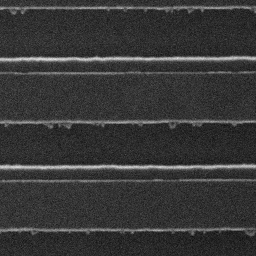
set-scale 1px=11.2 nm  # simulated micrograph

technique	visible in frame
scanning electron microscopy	lines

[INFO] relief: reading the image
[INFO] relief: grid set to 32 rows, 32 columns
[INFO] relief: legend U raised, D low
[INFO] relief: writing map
UUUUUUUUUUUUUUUUUUUUUUUUUUUUUUUU
DUDDDDDDDDDDDDDDDDDDDDDDDDDDDDDD
DDDDDDDDDDDDDDDDDDDDDDDDDDDDDDDD
DDDDDDDDDDDDDDDDDDDDDDDDDDDDDDDD
DDDDDDDDDDDDDDDDDDDDDDDDDDDDDDDD
DDDDDDDDDDDDDDDDDDDDDDDDDDDDDDDD
DDDDDDDDDDDDDDDDDDDDDDDDDDDDDDDD
DDDDDDDDDDDDDDDDDDDDDDDDDDDDDDDD
DDDDDDDDDDDDDDDDDDDDDDDDDDDDDDDD
UUUUUUUUUUUUUUUUUUUUUUUUUUUUUUUU
UUUUUUUUUUUUUUUUUUUUUUUUUUUUUUUU
UUUUUUUUUUUUUUUUUUUUUUUUUUUUUUUU
UUUUUUUUUUUUUUUUUUUUUUUUUUUUUUUU
UUUUUUUUUUUUUUUUUUUUUUUUUUUUUUUU
UUUUUUUUUUUUUUUUUUUUUUUUUUUUUUUU
DDDDDDUUUDDDUDDDDDDDDUDDUDDDDDDD
DDDDDDDDDDDDDDDDDDDDDDDDDDDDDDDD
DDDDDDDDDDDDDDDDDDDDDDDDDDDDDDDD
DDDDDDDDDDDDDDDDDDDDDDDDDDDDDDDD
DDDDDDDDDDDDDDDDDDDDDDDDDDDDDDDD
DDDDDDDDDDDDDDDDDDDDDDDDDDDDDDDD
DDDDDDDDDDDDDDDDDDDDDDDDDDDDDDDD
DDDDDDDDDDDDDDDDDDDUUDUUUUUUUUUU
UUUUUUUUUUUUUUUUUUUUUUUUUUUUUUUU
UUUUUUUUUUUUUUUUUUUUUUUUUUUUUUUU
UUUUUUUUUUUUUUUUUUUUUUUUUUUUUUUU
UUUUUUUUUUUUUUUUUUUUUUUUUUUUUUUU
UUUUUUUUUUUUUUUUUUUUUUUUUUUUUUUU
UUUUUUUUUUUUUUUUUUUUUUUUUUUUUUUU
DDDDDDDDDDDDDDDDDDDDDDDDDDDDDDDD
DDDDDDDDDDDDDDDDDDDDDDDDDDDDDDDD
DDDDDDDDDDDDDDDDDDDDDDDDDDDDDDDD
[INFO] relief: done